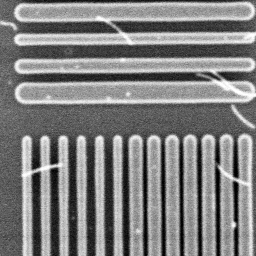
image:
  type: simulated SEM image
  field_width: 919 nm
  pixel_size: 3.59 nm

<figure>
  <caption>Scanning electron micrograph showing groups of lines, slits or small figures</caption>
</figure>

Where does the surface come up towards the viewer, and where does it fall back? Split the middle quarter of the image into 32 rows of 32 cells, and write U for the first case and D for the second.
UUUUUUUUUUUUUUUUUUUUUUUUUUUUUUUU
UUUUUUUUUUUUUUUUUUUUUUUUUUUUUUUU
DDDDDDDDDDDDDDDDDDDDDDDDDDDDDDDD
DDDDDDDDDDDDDDDDDDDDDDDDDDDDDDDD
DDDDDDDDDDDDDDDDDDDDDDDDDDDDDDDD
UUUUUUUUUUUUUUUUUUUUUUUUUUUUUUUU
UUUUUUUUUUUUUUUUUUUUUUUUUUUUUUUU
UUUUUUUUUUUUUUUUUUUUUUUUUUUUUUUU
UUUUUUUUUUUUUUUUUUUUUUUUUUUUUUUU
UUUUUUUUUUUUUUUUUUUUUUUUUUUUUUUU
DDDDDDDDDDDDDDDDDDDDDDDDDDDDDDDD
DDDDDDDDDDDDDDDDDDDDDDDDDDDDDDDD
DDDDDDDDDDDDDDDDDDDDDDDDDDDDDDDD
DDDDDDDDDDDDDDDDDDDDDDDDDDDDDDDD
DDDDDDDDDDDDDDDDDDDDDDDDDDDDDDDD
DDDDDDDDDDDDDDDDDDDDDDDDDDDDDDDD
DDDDDDDDDDDDDDDDDDDDDDDDDDDDDDDD
DDDDDDDDDDDDDDDDDDDDDDDDDDDDDDDD
DDDDUDDDUUDDDUDDDUUDDUUDDDUUDDUU
UDDUUDDDUUDDDUDDUUUDDUUUDDUUDDUU
UDDUUDDDUUDDUUDDUUUDDUUUDDUUDDUU
UDDUUDDDUUDDUUDDUUUDDUUUDDUUUDUU
UDDUUDDDUUDDUUDDUUUDDUUUDDUUUDUU
UDDUUDDDUUDDDUDDUUUDDUUUDUUUUDUU
UDDUUDDDUUDDDUDDUUUDDUUUDUUUUDUU
UDDUUDDDUUDDDUDDUUUDDUUUDDUUUDUU
UDDUUDDDUUDDDUDDUUUDDUUUDDUUUDUU
UDDUUDDDUUDDDUDDUUUDDUUUDDUUUDUU
UDDUUDDDUUDDDUDDUUUDDUUUDDUUUDUU
UDDUUDDDUUDDDUDDUUUDDUUUDDUUUDUU
UDDUUDDDUUDDDUDDUUUDDUUUDDUUUDUU
UDDUUDDDUUDDDUDDUUUDDUUUDDUUUDUU